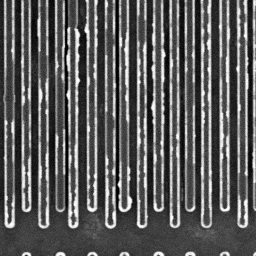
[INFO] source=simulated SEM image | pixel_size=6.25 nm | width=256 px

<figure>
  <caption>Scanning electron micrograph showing parallel lines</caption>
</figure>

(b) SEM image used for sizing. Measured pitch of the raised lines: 0.104 µm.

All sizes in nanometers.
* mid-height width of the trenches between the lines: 44.6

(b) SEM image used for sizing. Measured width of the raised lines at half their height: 60.2 nanometres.